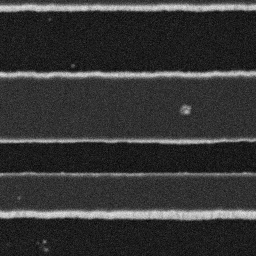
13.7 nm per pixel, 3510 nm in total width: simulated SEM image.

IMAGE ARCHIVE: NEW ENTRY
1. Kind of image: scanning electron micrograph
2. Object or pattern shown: lines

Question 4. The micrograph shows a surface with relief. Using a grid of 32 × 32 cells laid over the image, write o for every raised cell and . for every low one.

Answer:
oooooooooooooooooooooooooooooooo
................................
................................
................................
................................
................................
................................
................................
................................
ooooo.oooooooooooooooooooooooooo
oooooooooooooooooooooooooooooooo
oooooooooooooooooooooooooooooooo
oooooooooooooooooooooooooooooooo
oooooooooooooooooooooooooooooooo
oooooooooooooooooooooooooooooooo
oooooooooooooooooooooooooooooooo
oooooooooooooooooooooooooooooooo
oooooooooooooooooooooooooooooooo
oooooooooooooooooooooooooooooooo
oooooooooooooooooooooooooooooooo
oooooooooooooooooooooooooooooooo
oooooooooooooooooooooooooooooooo
oooooooooooooooooooooooooooooooo
oooooooooooooooooooooooooooooooo
oooooooooooooooooooooooooooooooo
oooooooooooooooooooooooooooooooo
oooooooooooooooooooooooooooooooo
................................
................................
................................
................................
................................